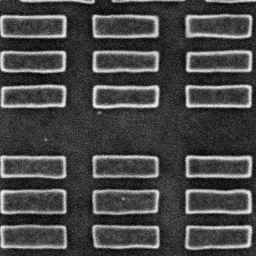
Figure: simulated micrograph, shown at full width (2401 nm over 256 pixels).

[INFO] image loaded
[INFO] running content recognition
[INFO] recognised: wiring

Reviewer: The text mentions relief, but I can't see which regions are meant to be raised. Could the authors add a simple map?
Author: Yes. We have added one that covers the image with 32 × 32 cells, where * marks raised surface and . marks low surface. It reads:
................................
................................
********....*******....********.
********....********...********.
.******.....*****...........***.
................................
................................
********....********...********.
********....********...********.
................................
................................
********....********...********.
********....********...********.
................................
................................
................................
................................
................................
................................
................................
********....********...********.
********....********...********.
................................
................................
********....********...********.
********....********...********.
.*******....*******.....*******.
................................
********....********...********.
********....********...********.
********....********...********.
................................